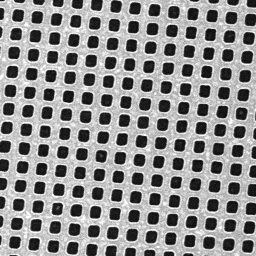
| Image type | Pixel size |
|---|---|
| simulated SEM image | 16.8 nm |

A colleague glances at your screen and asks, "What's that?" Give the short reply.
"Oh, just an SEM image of a regular array of holes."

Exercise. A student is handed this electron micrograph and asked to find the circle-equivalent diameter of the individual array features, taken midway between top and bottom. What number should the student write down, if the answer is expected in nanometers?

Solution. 222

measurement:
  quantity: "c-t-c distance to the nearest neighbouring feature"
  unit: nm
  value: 315